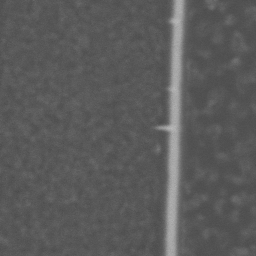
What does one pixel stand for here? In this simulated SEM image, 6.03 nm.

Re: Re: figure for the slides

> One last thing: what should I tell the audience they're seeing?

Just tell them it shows one or a few lines or trenches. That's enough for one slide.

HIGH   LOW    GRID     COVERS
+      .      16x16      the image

...........+++++
...........+++++
...........+++++
...........+++++
...........+++++
...........+++++
...........+++++
...........+++++
...........+++++
...........+++++
...........+++++
...........+++++
...........+++++
...........+++++
...........+++++
...........+++++